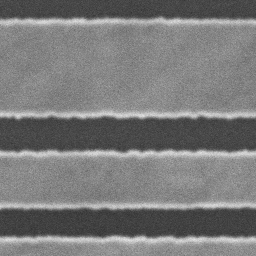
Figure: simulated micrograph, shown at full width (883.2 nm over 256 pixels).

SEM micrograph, lines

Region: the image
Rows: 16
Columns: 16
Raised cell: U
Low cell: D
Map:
DDDDDDDDDDDDDDDD
UUUUUUUUUUUUUUUU
UUUUUUUUUUUUUUUU
UUUUUUUUUUUUUUUU
UUUUUUUUUUUUUUUU
UUUUUUUUUUUUUUUU
UUUUUUUUUUUUUUUU
DDDDDDDDDDDDDDDD
DDDDDDDDDDDDDDDD
DDDUUUUDUUUDUDDU
UUUUUUUUUUUUUUUU
UUUUUUUUUUUUUUUU
UUUUUUUUUUUUUUUU
DDDDDDDDDDDDDDDD
DDDDDDDDDDDDDDDD
UUUUUUUUUUUUUUUU